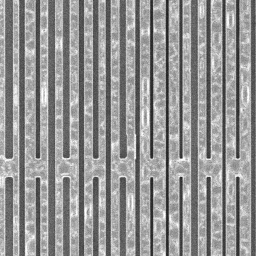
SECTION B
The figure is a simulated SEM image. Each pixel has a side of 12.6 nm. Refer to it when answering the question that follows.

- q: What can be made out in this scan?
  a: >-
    parallel lines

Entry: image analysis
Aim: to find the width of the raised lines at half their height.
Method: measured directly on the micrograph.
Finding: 0.112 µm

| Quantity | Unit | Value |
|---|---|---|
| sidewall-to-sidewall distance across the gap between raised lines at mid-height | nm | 64.5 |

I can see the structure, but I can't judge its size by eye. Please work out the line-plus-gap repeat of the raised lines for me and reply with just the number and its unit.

0.18 micrometres